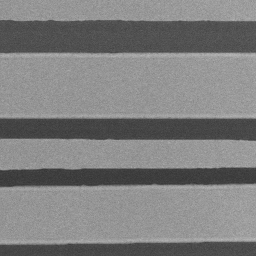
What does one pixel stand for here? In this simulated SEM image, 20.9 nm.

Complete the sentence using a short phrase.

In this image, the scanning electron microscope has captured lines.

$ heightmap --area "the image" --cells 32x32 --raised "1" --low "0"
11111111111111111111111111111111
11111111111111111111111111111111
01111111111000011111111111111111
00000000000000000000000000000000
00000000000000000000000000000000
00000000000000000000000000000000
00000000000000000000000000000000
11111111111111111111111111111111
11111111111111111111111111111111
11111111111111111111111111111111
11111111111111111111111111111111
11111111111111111111111111111111
11111111111111111111111111111111
11111111111111111111111111111111
11111111111111111111111111111111
00000000000000000000000000000000
00000000000000000000000000000000
11111111111101000000000000000000
11111111111111111111111111111111
11111111111111111111111111111111
11111111111111111111111111111111
00000000000000000000000000000000
00000000000000000000000000000000
11111111111111111111111111111111
11111111111111111111111111111111
11111111111111111111111111111111
11111111111111111111111111111111
11111111111111111111111111111111
11111111111111111111111111111111
11111111111111111111111111111111
11110000000000000000000000000000
00000000000000000000000000000000